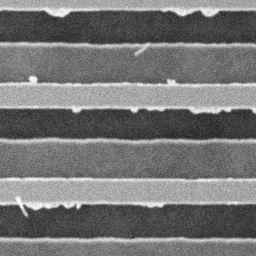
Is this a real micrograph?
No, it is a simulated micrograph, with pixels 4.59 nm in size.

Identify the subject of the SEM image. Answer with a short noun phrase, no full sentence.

lines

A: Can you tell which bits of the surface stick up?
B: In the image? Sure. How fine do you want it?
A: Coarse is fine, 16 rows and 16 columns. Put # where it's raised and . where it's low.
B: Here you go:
################
................
................
################
################
################
################
................
................
################
################
################
################
................
................
################